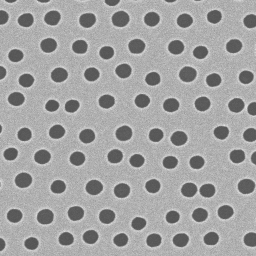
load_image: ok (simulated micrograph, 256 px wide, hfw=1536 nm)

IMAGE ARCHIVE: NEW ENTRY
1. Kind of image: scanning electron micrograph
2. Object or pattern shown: a regular array of holes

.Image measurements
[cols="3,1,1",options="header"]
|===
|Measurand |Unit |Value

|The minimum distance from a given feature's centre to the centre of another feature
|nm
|158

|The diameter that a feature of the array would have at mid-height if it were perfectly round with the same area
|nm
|89.1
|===